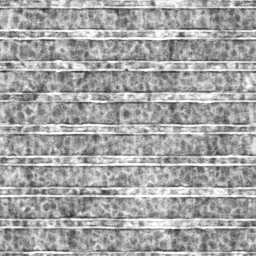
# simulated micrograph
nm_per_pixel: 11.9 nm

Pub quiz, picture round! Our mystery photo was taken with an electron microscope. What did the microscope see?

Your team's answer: parallel lines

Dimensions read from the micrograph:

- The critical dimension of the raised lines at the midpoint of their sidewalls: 101 nm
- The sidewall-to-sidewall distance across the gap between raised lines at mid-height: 273 nm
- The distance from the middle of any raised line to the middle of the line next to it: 374 nanometers